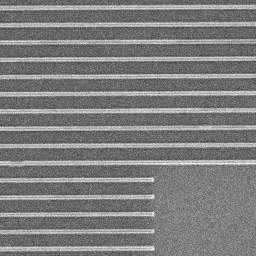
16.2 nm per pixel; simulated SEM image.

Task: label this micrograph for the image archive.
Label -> parallel lines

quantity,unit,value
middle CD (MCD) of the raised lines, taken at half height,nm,44.5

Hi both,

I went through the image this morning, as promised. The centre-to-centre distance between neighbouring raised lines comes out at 278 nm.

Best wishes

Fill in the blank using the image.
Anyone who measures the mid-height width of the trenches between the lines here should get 0.234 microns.